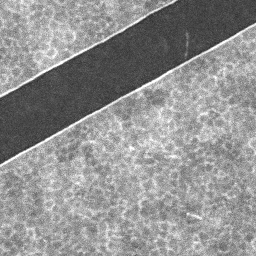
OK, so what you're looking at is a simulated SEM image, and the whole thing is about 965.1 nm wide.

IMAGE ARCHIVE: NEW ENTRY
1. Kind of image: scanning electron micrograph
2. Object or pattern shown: one or a few lines or trenches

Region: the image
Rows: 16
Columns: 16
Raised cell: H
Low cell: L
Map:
HHHHHHHHHHLLLLLL
HHHHHHHHLLLLLLLL
HHHHHHHLLLLLLLHH
HHHHHLLLLLLLHHHH
HHHLLLLLLLLHHHHH
HLLLLLLLLHHHHHHH
LLLLLLLHHHHHHHHH
LLLLLHHHHHHHHHHH
LLLHHHHHHHHHHHHH
LHHHHHHHHHHHHHHH
HHHHHHHHHHHHHHHH
HHHHHHHHHHHHHHHH
HHHHHHHHHHHHHHHH
HHHHHHHHHHHHHHHH
HHHHHHHHHHHHHHHH
HHHHHHHHHHHHHHHH